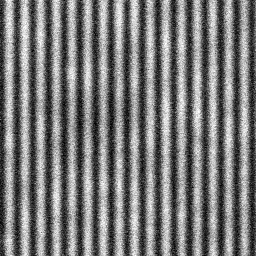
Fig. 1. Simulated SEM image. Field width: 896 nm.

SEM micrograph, parallel lines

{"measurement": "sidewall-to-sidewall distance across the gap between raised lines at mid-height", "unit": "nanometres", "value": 27.6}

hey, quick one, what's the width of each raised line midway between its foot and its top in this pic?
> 0.0276 micrometres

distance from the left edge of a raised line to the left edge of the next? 54.9 nm